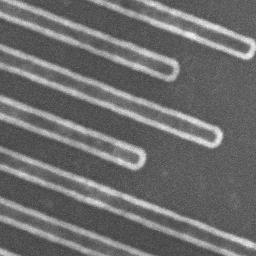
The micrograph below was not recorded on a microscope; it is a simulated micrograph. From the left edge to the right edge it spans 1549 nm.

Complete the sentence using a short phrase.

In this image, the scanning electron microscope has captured parallel lines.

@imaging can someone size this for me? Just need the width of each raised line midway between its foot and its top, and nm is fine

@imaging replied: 107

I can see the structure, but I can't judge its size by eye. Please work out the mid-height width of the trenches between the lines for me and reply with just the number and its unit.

0.179 um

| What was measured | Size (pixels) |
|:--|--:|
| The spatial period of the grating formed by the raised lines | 47.5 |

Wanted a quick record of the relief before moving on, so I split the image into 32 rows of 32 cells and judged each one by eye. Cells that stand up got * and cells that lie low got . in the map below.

**...........******.............
*****...........******..........
.*******..........*******.......
....*******..........******.....
.......******...........******..
.........*******..........******
**..........******...........***
****...........******...........
.******..........*****..........
...*******..........**..........
......******....................
.........******.................
*..........******...............
***...........******............
******...........******.........
...******..........******.......
.....******...........*****.....
........******..........***.....
..........*******...............
***..........*****..............
*****..........***..............
..******........................
....******......................
.......******...................
.........*******................
*...........******..............
****...........******...........
.******..........*******........
...******...........******......
......******..........******....
........******...........******.
...........******...........****